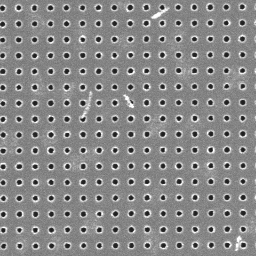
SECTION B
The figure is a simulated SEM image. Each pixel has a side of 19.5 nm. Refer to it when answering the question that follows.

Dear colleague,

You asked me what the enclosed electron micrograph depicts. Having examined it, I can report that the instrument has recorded a regular array of holes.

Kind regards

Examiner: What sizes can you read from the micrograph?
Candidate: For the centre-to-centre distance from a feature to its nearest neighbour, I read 0.299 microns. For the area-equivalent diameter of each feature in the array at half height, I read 103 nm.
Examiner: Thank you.